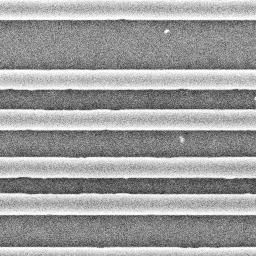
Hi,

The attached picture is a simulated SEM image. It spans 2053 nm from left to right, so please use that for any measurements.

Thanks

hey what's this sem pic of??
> lines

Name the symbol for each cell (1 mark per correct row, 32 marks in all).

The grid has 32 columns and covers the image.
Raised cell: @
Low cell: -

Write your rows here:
@@@@@@@@@@@@@@@@@@@@@@@@@@@@@@@@
@@@@@@@@@@@@@@@@@@@@@@@@@@@@@@@@
--------------------------------
--------------------------------
--------------------------------
--------------------------------
--------------------------------
--------------------------------
--------------------------------
@@@@@@@@@@@@@@@@@@@@@@@@@@@@@@@@
@@@@@@@@@@@@@@@@@@@@@@@@@@@@@@@@
--------------------------------
--------------------------------
--------------------------------
@@@@@@@@@@@@@@@@@@@@@@@@@@@@@@@@
@@@@@@@@@@@@@@@@@@@@@@@@@@@@@@@@
--------------------------------
--------------------------------
--------------------------------
--------------------------------
@@@@@@@@@@@@@@@@@@@@@@@@@@@@@@@@
@@@@@@@@@@@@@@@@@@@@@@@@@@@@@@@@
--------------------------------
--------------------------------
@@@@@@@@@@@@@@@@@@@@@@@@@@@@@@@@
@@@@@@@@@@@@@@@@@@@@@@@@@@@@@@@@
@@@@@@@@@@@@@@@@@@@@@@@@@@@@@@@@
--------------------------------
--------------------------------
--------------------------------
--------------------------------
@@@@@@@@@@@@@@@@@@@@@@@@@@@@@@@@